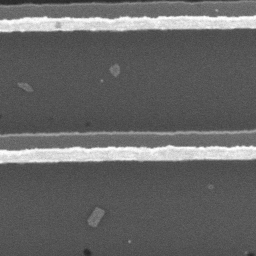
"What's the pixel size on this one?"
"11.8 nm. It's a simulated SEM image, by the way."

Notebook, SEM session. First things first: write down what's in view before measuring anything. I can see lines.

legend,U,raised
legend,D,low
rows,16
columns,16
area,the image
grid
UUUUUUUUUUUUUUUU
UUUUUUUUUUUUUUUU
DDDDDDDDDDDDDDDD
DDDDDDDDDDDDDDDD
DDDDDDDDDDDDDDDD
DDDDDDDDDDDDDDDD
DDDDDDDDDDDDDDDD
DDDDDDDDDDDDDDDD
UUUUUUUUUUUUUUUU
UUUUUUUUUUUUUUUU
DDDDDDDDDDDDDDDD
DDDDDDDDDDDDDDDD
DDDDDDDDDDDDDDDD
DDDDDDDDDDDDDDDD
DDDDDDDDDDDDDDDD
DDDDDDDDDDDDDDDD